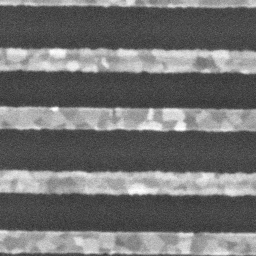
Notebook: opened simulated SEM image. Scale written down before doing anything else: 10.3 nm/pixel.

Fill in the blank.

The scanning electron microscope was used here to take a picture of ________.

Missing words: lines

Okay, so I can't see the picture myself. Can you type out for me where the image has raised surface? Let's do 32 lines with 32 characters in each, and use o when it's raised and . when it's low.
oooooooooooooooooooooooooooooooo
................................
................................
................................
................................
................................
oooooooooooooooooooooooooo..o...
oooooooooooooooooooooooooooooooo
oooooooooooooooooooooooooooooooo
................................
................................
................................
................................
oo.oo...........................
oooooooooooooooooooooooooooooooo
oooooooooooooooooooooooooooooooo
................................
................................
................................
................................
................................
.oo.............................
oooooooooooooooooooooooooooooooo
oooooooooooooooooooooooooooooooo
................................
................................
................................
................................
................................
oooooooooooooooooooooooooooooooo
oooooooooooooooooooooooooooooooo
ooooooooo.oooooooooooooooooooooo